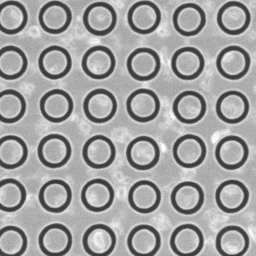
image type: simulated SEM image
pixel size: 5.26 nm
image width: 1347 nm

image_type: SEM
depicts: a regular array of ring-shaped grooves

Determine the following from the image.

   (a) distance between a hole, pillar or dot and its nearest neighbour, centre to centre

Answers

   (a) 227 nanometres